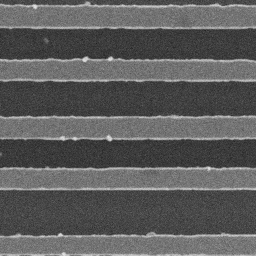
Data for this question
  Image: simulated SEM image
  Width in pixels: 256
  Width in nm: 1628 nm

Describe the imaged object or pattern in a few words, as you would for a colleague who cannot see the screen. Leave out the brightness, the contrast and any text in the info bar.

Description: lines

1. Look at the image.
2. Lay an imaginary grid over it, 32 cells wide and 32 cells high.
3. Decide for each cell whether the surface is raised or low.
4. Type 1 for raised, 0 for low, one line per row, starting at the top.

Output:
00000000000000000000000000000000
11111111111111111111111111111111
11111111111111111111111111111111
01001111111111111111111111111110
00000000000000000000000000000000
00000000000000000000000000000000
00000000000000000000000000000000
11111111111111111111111111100110
11111111111111111111111111111111
11111111111111111111111111111111
00000000000000000000000000000000
00000000000000000000000000000000
00000000000000000000000000000000
00000000000000000000000000000000
00000000000000000000000000000000
11111111111111111111111111111111
11111111111111111111111111111111
00000001000001000000000000000000
00000000000000000000000000000000
00000000000000000000000000000000
00000000000000000000000000000000
11111111111111111111111111111111
11111111111111111111111111111111
11111111111111111111111111111111
00000000000000000000000000000000
00000000000000000000000000000000
00000000000000000000000000000000
00000000000000000000000000000000
00000000000000000000000000000000
00000001000111111001111011111111
11111111111111111111111111111111
11111111111111111111111111111111